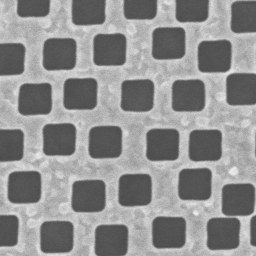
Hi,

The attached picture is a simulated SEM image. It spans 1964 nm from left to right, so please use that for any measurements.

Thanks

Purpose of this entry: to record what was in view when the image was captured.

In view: a regular array of holes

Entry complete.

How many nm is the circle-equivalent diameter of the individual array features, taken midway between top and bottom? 282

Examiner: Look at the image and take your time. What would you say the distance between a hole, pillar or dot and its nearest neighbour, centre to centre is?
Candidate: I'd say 359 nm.